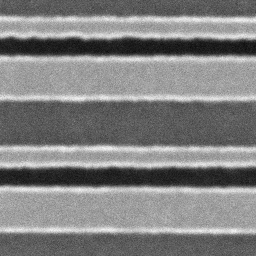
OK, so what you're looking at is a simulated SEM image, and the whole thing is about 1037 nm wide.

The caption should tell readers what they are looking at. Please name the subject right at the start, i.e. lines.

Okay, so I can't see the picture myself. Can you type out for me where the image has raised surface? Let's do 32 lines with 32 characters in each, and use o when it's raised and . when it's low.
................................
................................
oooooooooooooooooooooooooooooooo
oooooooooooooooooooooooooooooooo
o.ooooooo.oooooooooooooooooooooo
................................
................................
oooooooooooooooooooooooooooooooo
oooooooooooooooooooooooooooooooo
oooooooooooooooooooooooooooooooo
oooooooooooooooooooooooooooooooo
oooooooooooooooooooooooooooooooo
................................
................................
................................
................................
................................
................................
ooooooooooooooooo..oo...o.......
oooooooooooooooooooooooooooooooo
oooooooooooooooooooooooooooooooo
................................
................................
oo..............................
oooooooooooooooooooooooooooooooo
oooooooooooooooooooooooooooooooo
oooooooooooooooooooooooooooooooo
oooooooooooooooooooooooooooooooo
oooooooooooooooooooooooooooooooo
................................
................................
................................